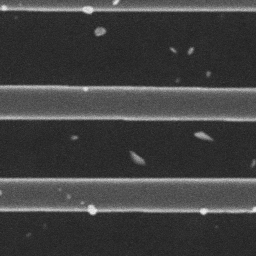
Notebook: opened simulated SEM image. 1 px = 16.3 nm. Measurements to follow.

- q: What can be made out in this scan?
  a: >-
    lines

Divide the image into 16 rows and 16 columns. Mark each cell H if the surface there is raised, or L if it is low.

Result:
HHHHHHHHHHHHHHHH
LLLLLLLLLLLLLLLL
LLLLLLLLLLLLLLLL
LLLLLLLLLLLLLLLL
LLLLLLLLLLLLLLLL
HHHHHHHHHHHHLLLL
HHHHHHHHHHHHHHHH
LLLLLLLLLLLLLLLH
LLLLLLLLLLLLLLLL
LLLLLLLLLLLLLLLL
LLLLLLLLLLLLLLLL
HHHHHHHHHHHHHHHH
HHHHHHHHHHHHHHHH
LLLLLLLLLLLLLLLL
LLLLLLLLLLLLLLLL
LLLLLLLLLLLLLLLL